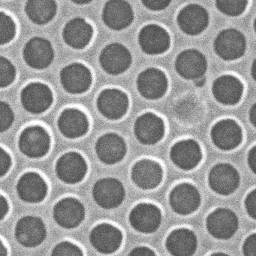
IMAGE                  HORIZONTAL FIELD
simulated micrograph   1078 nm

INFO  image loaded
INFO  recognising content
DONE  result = a regular array of holes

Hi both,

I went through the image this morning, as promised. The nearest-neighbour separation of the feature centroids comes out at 0.184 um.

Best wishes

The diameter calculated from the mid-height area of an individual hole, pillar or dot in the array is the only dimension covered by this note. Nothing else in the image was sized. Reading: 139 nm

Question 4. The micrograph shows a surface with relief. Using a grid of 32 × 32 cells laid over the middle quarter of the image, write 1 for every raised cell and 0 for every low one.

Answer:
00000111100000000111111111110000
00000001110000001111000011110000
00000001111000111110000001110000
00000001111111111100000000111000
00000001111111111100000000111111
00000001111111111100000000111111
00000011110000111100000000111111
10001111100000001110000001111111
11111111000000001111000011111111
11111111000000001111111111111111
11111111000000001111111111111111
00001111000000001111111111111111
00000111100000001110000111111111
00000011110000011100000001111111
00000011111111111100000001111111
00000011111111111000000001111111
00000011111111111000000001111111
00000011100001111000000001111111
10001111000000011100000001111111
11111111000000011110000011110000
11111111000000001111111111100000
11111111000000001111111111000000
00001111000000001111111111000000
00000111100000011111111111000000
00000011100000111100000111100000
00000011111111111000000011110000
00000011111111111000000001111100
00000011111111111000000001111111
00000111110001111000000001111111
00001111000000111000000011111111
11111110000000011100000011110000
11111110000000011111001111100000